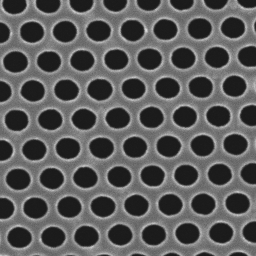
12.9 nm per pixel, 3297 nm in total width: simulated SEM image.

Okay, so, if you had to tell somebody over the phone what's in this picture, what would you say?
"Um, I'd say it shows a regular array of holes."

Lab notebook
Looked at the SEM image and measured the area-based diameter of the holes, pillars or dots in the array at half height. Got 292 nanometers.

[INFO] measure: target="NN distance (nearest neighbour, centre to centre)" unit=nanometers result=427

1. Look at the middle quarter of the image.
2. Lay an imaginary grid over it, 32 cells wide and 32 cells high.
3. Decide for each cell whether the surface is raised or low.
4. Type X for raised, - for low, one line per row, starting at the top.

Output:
XX-----XXXX-----XXX-----XXXX----
XXX---XXXXXX--XXXXXXX-XXXXXXXXXX
XXXXXXXXXXXXXXXXXXXXXXXXXXXXXXXX
XXXXXXXXXXXXXXXXX-XXXXXXX--XXXXX
--XXXXX----XXXX-----XXX-----XXXX
---XXX------XX------XXX------XX-
----XX------XXX-----XXX------XX-
---XXX------XXX-----XXX------XXX
---XXXX----XXXXX--XXXXXXX--XXXXX
XXXXXXXXXXXXXXXXXXXXXXXXXXXXXXXX
XXXXXXXXXXXXXXXXXXXXXXXXXXXXXXXX
XXX---XXXXXX---XXXXX----XXXX----
XX-----XXXX-----XXX------XX-----
XX------XX-------XX------XX-----
XX------XXX-----XXX------XX-----
XXX----XXXX-----XXXX----XXXXX---
XXXX-XXXXXXXXXXXXXXXXXXXXXXXXXXX
XXXXXXXXXXXXXXXXXXXXXXXXXXXXXXXX
--XXXXXX--XXXXXX---XXXXX----XXXX
----XXX-----XXX-----XXX------XXX
----XX------XXX------XX------XXX
----XX------XXX------XX------XXX
----XXX-----XXX-----XXXX----XXXX
---XXXXXX--XXXXXXXXXXXXXXXXXXXXX
XXXXXXXXXXXXXXXXXXXXXXXXXXXXXXXX
XXXXXXXXXXXXX-XXXXXXX--XXXXXX---
XXX----XXXX-----XXXX-----XXX----
XX------XXX------XX------XXX----
XX-------XX------XX------XXX----
XXX-----XXX-----XXXX-----XXX----
XXXX---XXXXX---XXXXXX---XXXXXX-X
XXXXXXXXXXXXXXXXXXXXXXXXXXXXXXXX